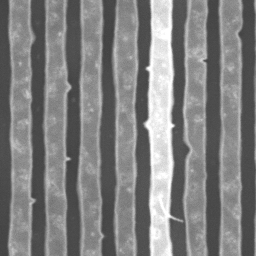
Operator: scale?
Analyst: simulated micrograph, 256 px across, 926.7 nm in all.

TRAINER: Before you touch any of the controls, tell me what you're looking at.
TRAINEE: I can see parallel lines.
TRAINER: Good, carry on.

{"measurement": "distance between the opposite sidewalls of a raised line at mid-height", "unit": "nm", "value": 72.4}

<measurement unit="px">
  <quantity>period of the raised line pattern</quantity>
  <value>35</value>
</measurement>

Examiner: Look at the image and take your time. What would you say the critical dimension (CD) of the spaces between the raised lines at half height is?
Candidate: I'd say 54.3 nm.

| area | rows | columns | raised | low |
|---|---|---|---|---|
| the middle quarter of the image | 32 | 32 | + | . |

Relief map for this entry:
.....++++...++++++...++++++...++
+...+++++...++++++...++++++...++
+...+++++....+++++....+++++...++
+...+++++....+++++...++++++...++
+...+++++....+++++...++++++...++
++..+++++....+++++...++++++...++
+...+++++....+++++...++++++...++
+...+++++....+++++...++++++...++
+...+++++....+++++...++++++...++
....+++++....+++++...++++++...++
....+++++....+++++...++++++...++
....+++++....++++....+++++....++
+...+++++....+++++...+++++....++
....+++++....+++++...+++++....++
....+++++....+++++...++++++...++
....+++++....+++++...++++++...++
....+++++....+++++...+++++....++
....+++++....+++++...+++++....++
....+++++....+++++....++++....++
....+++++....+++++....++++....++
....+++++....+++++....+++++....+
....+++++....+++++....+++++.....
....+++++....+++++....+++++....+
+...+++++....+++++....+++++....+
....+++++....+++++....+++++....+
....+++++....+++++....+++++....+
....+++++....+++++....+++++....+
....+++++....+++++....+++++....+
...++++++....+++++....+++++....+
...++++++....+++++....+++++....+
....+++++....+++++....+++++...++
....+++++....++++.....++++....++